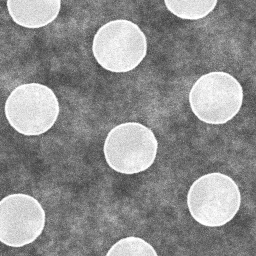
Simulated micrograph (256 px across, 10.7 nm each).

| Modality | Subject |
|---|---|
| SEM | raised bodies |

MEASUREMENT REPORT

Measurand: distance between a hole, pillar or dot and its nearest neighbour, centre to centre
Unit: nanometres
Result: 1060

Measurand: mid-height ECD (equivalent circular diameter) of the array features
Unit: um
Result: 0.546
